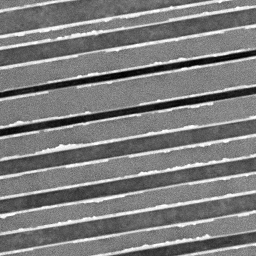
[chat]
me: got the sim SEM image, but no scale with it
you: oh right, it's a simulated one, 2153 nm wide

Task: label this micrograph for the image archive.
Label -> parallel lines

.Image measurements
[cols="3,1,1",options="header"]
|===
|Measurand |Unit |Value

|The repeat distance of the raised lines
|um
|0.304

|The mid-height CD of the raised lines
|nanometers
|188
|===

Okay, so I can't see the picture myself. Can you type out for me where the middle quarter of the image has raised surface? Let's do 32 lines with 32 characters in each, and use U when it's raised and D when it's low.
UUUUUUUUUUUUUUUUUUUUUUDDDDDDDDDD
UUUUUUUUUUUUUUUUDDDDDDDDDDDDUUUU
UUUUUUUUUUDDDDDDDDDDDDUUUUUUUUUU
UUUUDDDDDDDDDDDDUUUUUUUUUUUUUUUU
DDDDDDDDDDUUUUUUUUUUUUUUUUUUUUUU
DDDUUUUUUUUUUUUUUUUUUUUUUUUUUUUU
UUUUUUUUUUUUUUUUUUUUUUUUUUUUUUUU
UUUUUUUUUUUUUUUUUUUUUUUUUUUUUUUU
UUUUUUUUUUUUUUUUUUUUUUUUUUUUUUDD
UUUUUUUUUUUUUUUUUUUUUUUUDDDDDDDD
UUUUUUUUUUUUUUUUUUDDDDDDDDDDDDUU
UUUUUUUUUUUUDDDDDDDDDDDDUUUUUUUU
UUUUUUDDDDDDDDDDDDUUUUUUUUUUUUUU
DDDDDDDDDDDDUUUUUUUUUUUUUUUUUUUU
DDDDDDUUUUUUUUUUUUUUUUUUUUUUUUUU
UUUUUUUUUUUUUUUUUUUUUUUUUUUUUUUU
UUUUUUUUUUUUUUUUUUUUUUUUUUUUUDDD
UUUUUUUUUUUUUUUUUUUUUUUDDDDDDDDD
UUUUUUUUUUUUUUUUUDDDDDDDDDDDDDDD
UUUUUUUUUUUUDDDDDDDDDDDDDDDDDDDD
UUUUUDDDDDDDDDDDDDDDDDDDDDDDDDDU
DDDDDDDDDDDDDDDDDDDDDDDDDUUUUUUU
DDDDDDDDDDDDDDDDDDUUUUUUUUUUUUUU
DDDDDDDDDDDDDUUUUUUUUUUUUUUUUUUU
DDDDDDUUUUUUUUUUUUUUUUUUUUUUUUUU
UUUUUUUUUUUUUUUUUUUUUUUUUUUUUUUU
UUUUUUUUUUUUUUUUUUUUUUUUUUUDDDDD
UUUUUUUUUUUUUUUUUUUUUDDDDDDDDDDD
UUUUUUUUUUUUUUUDDDDDDDDDDDDDDDDD
UUUUUUUUUDDDDDDDDDDDDDDDDDDDDDDD
UUUDDDDDDDDDDDDDDDDDDDDDDDDUUUUU
DDDDDDDDDDDDDDDDDDDDDUUUUUUUUUUU